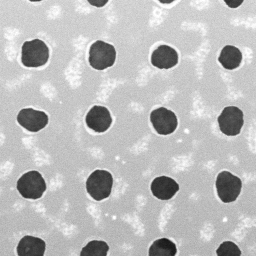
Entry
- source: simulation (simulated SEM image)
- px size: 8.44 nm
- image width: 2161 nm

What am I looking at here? a regular array of holes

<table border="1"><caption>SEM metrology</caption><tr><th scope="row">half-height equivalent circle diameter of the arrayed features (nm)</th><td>241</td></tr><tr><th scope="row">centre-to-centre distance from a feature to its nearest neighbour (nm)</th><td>538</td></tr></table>